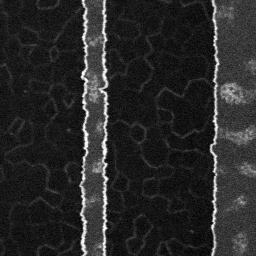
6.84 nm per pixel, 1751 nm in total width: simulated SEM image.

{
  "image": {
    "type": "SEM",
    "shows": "one or a few lines or trenches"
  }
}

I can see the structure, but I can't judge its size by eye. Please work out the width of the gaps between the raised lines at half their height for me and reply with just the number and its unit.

0.75 µm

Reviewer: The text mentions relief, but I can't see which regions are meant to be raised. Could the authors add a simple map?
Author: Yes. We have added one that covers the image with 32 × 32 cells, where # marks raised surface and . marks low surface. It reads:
..........###..............#####
...........##..............#####
...........##..............#####
...........##..............#####
..........###..............#####
...........##..............#####
...........##..............#####
...........##..............#####
...........##..............#####
..........###..............#####
...........##..............#####
..........###..............#####
..........###..............#####
...........##..............#####
...........##..............#####
...........##..............#####
...........##..............#####
...........##..............#####
...........##.............######
...........##..............#####
..........###..............#####
..........###..............#####
..........###..............#####
..........###..............#####
..........###..............#####
..........###..............#####
..........###..............#####
..........###..............#####
...........##..............#####
..........###..............#####
..........###..............#####
..........###..............#####